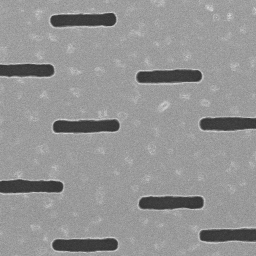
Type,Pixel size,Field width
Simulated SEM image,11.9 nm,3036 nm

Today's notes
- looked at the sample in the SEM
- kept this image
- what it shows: holes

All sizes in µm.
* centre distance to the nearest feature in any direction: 1.16